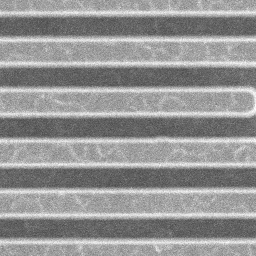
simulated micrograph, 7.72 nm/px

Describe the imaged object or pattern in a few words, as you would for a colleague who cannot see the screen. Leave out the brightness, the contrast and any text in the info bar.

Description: parallel lines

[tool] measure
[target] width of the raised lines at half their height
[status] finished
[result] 211 nanometers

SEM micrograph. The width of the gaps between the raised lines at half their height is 184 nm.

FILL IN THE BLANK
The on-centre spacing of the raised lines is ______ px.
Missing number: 50.5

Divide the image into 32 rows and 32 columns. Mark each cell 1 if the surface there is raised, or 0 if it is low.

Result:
11111111111111111111111111111111
11111111111111111111111111111111
00000000000000000000000000000000
00000000000000000000000000000000
00000000000000000000000000000000
11111111111111111111111111111111
11111111111111111111111111111111
11111111111111111111111111111111
00000000000000000000000000000000
00000000000000000000000000000000
00000000000000000000000000000000
11111111111111111111111111111111
11111111111111111111111111111111
11111111111111111111111111111111
00000000000000000000000000000000
00000000000000000000000000000000
00000000000000000000000000000000
00000000000000000001111111111111
11111111111111111111111111111111
11111111111111111111111111111111
11111111111111111111111111111111
00000000000000000000000000000000
00000000000000000000000000000000
00000000000000000000000000000000
11111111111111111111111111111111
11111111111111111111111111111111
11111111111111111111111111111111
00000000000000000000000000000000
00000000000000000000000000000000
00000000000000000000000000000000
11111111111111111111111111111111
11111111111111111111111111111111